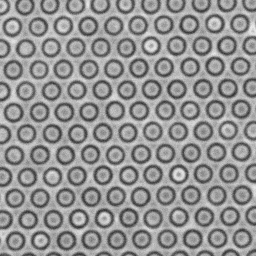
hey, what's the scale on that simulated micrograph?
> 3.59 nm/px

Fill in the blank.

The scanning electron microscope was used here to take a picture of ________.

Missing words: a regular array of ring-shaped grooves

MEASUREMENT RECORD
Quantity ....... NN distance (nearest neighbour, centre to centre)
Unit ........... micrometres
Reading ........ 0.0868